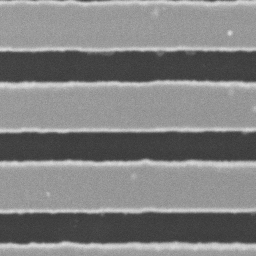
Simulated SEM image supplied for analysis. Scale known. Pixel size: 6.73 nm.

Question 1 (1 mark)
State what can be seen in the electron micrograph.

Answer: lines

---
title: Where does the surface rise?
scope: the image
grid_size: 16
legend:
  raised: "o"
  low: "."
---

oooooooooooooooo
oooooooooooooooo
oooooooooooooooo
................
................
oooooooooooooooo
oooooooooooooooo
oooooooooooooooo
................
................
oooooooooooooooo
oooooooooooooooo
oooooooooooooooo
................
................
oooooooooooooooo